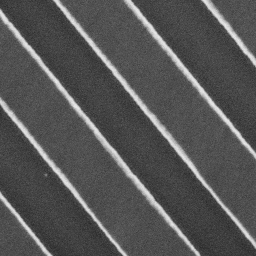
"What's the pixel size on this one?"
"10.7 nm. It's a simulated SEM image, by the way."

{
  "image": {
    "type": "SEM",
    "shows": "lines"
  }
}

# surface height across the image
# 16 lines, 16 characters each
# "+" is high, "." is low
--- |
....+++++....+++
+....++++.....++
+....+++++.....+
++....+++++.....
+++....+++++....
++++....+++++...
+++++....++++...
.+++++...+++++..
..++++....+++++.
..+++++....+++++
...+++++....++++
....+++++....+++
.....+++++....++
+.....++++....++
++.....++++....+
+++....+++++....